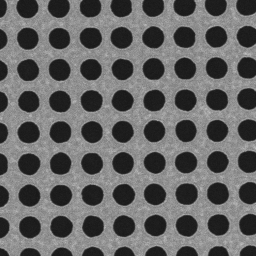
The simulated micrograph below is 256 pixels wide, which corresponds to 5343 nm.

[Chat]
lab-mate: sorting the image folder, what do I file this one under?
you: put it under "a regular array of holes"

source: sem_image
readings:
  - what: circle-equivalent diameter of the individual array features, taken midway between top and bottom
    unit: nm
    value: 458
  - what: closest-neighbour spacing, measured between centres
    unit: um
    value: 0.65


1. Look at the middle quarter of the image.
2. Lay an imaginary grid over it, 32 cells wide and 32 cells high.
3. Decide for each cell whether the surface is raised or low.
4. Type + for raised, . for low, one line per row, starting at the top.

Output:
.+++.....+++.....+++.....+++....
..++......++.....+++.....+++....
..++.....+++.....+++.....+++....
.++++...+++++...+++++...+++++...
++++++++++++++++++++++++++++++++
++++++++++++++++++++++++++++++++
+++++++.++++++.+++++++.++++++..+
.++++....+++.....++++....+++....
..++......++.....+++.....+++....
..++......++.....+++.....++.....
..++.....+++.....+++.....+++....
.++++....++++...+++++...+++++...
++++++++++++++++++++++++++++++++
++++++++++++++++++++++++++++++++
++++++..++++++..+++++...+++++...
.++++....+++.....+++.....+++....
..++......++.....+++.....+++....
..++......++.....+++.....+++....
.++++....++++....+++.....+++....
.+++++..++++++..+++++..+++++++.+
++++++++++++++++++++++++++++++++
++++++++++++++++++++++++++++++++
+++++...+++++...+++++...+++++...
..+++....+++.....+++.....+++....
..++......++.....+++......++....
..++......++.....+++.....+++....
.++++....++++....++++....+++....
++++++..++++++.+++++++++++++++.+
++++++++++++++++++++++++++++++++
++++++++++++++++++++++++++++++++
.+++++..+++++....++++...+++++...
..+++.....++......++.....+++....